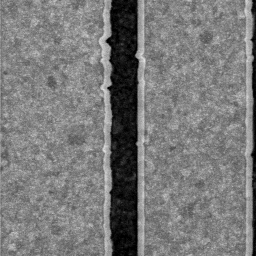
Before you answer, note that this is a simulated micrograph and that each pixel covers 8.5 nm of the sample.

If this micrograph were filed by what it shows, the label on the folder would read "one or a few lines or trenches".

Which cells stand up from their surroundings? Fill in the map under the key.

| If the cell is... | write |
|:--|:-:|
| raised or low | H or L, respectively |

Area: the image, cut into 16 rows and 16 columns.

HHHHHHHLLHHHHHHH
HHHHHHHLLHHHHHHH
HHHHHHHLLHHHHHHH
HHHHHHHLLHHHHHHH
HHHHHHHLLHHHHHHH
HHHHHHHLLHHHHHHH
HHHHHHHLLHHHHHHH
HHHHHHHLLHHHHHHH
HHHHHHHLLHHHHHHH
HHHHHHHLLHHHHHHH
HHHHHHHLLHHHHHHH
HHHHHHHLLHHHHHHH
HHHHHHHLLHHHHHHH
HHHHHHHLLHHHHHHH
HHHHHHHLLHHHHHHH
HHHHHHHLLHHHHHHH